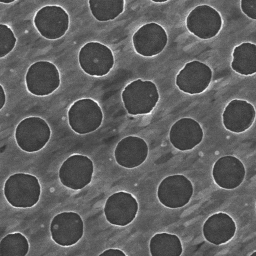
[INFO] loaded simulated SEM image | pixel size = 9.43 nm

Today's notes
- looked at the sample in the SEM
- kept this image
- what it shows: a regular array of holes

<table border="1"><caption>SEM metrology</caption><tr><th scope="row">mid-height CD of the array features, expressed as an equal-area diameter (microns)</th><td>0.319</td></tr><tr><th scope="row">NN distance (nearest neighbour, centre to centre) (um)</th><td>0.534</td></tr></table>